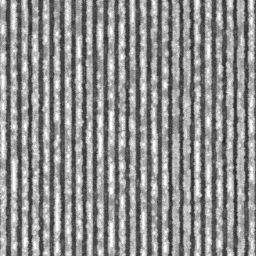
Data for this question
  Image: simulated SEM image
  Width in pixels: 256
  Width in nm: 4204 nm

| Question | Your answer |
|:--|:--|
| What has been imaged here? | parallel lines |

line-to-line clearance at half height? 0.0821 micrometres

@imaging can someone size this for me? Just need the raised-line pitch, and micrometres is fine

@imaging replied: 0.177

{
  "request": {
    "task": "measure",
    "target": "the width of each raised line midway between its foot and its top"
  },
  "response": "96.5 nm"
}